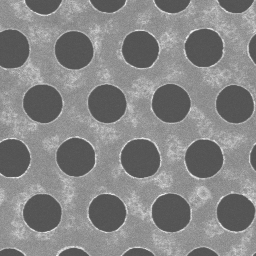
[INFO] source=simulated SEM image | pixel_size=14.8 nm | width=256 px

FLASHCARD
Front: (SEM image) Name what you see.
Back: a regular array of holes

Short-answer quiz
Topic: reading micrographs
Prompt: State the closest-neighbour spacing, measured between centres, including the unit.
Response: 920 nm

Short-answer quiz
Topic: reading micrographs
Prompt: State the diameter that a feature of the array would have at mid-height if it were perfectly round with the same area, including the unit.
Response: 0.573 microns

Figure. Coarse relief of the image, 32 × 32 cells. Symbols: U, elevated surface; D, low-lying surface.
UUUDDDDDUUUUDDDDUUUUDDDDUUUDDDDU
UUUUDDDUUUUUUDUUUUUUUDUUUUUUUDUU
UUUUUUUUUUUUUUUUUUUUUUUUUUUUUUUU
UUUUUUUUUUUUUUUUUUUUUUUUUUUUUUUU
DDDUUUUUDDDUUUUUDDDUUUUUDDDUUUUU
DDDDUUUDDDDDUUUDDDDDUUUDDDDDUUUD
DDDDUUUDDDDDUUUDDDDDUUUDDDDDUUUD
DDDUUUUDDDDUUUUUDDDUUUUUDDDUUUUU
DDUUUUUUDDUUUUUUUUUUUUUUUUUUUUUU
UUUUUUUUUUUUUUUUUUUUUUUUUUUUUUUU
UUUUUUUUUUUUUUUUUUUUUUUUUUUUUUUU
UUUDDDDUUUUDDDDUUUUDDDDUUUUUDDDU
UUUDDDDDUUUDDDDDUUUDDDDDUUUDDDDD
UUUDDDDDUUUDDDDDUUUDDDDDUUUDDDDD
UUUUDDDUUUUUDDDUUUUUDDDUUUUUDDDU
UUUUUUUUUUUUUUUUUUUUUUUUUUUUUUUU
UUUUUUUUUUUUUUUUUUUUUUUUUUUUUUUU
UDUUUUUUDDDUUUUUUDUUUUUUUDUUUUUU
DDDUUUUDDDDDUUUDDDDDUUUUDDDUUUUU
DDDDUUUDDDDDUUUDDDDDUUUDDDDDUUUD
DDDDUUUDDDDDUUUDDDDDUUUDDDDDUUUD
DDDUUUUUDDDUUUUUDDDDUUUUDDDUUUUU
UUUUUUUUUUUUUUUUUUUUUUUUUUUUUUUU
UUUUUUUUUUUUUUUUUUUUUUUUUUUUUUUU
UUUUDDUUUUUUDDUUUUUUDDUUUUUUDDDU
UUUDDDDUUUUDDDDUUUUDDDDDUUUDDDDD
UUUDDDDDUUUDDDDDUUUDDDDDUUUDDDDD
UUUDDDDDUUUDDDDDUUUDDDDDUUUDDDDD
UUUUDDDUUUUUDDDUUUUUDDDUUUUUDDDU
UUUUUUUUUUUUUUUUUUUUUUUUUUUUUUUU
UUUUUUUUUUUUUUUUUUUUUUUUUUUUUUUU
DDDUUUUUDDDUUUUUDDDUUUUUDDDUUUUU